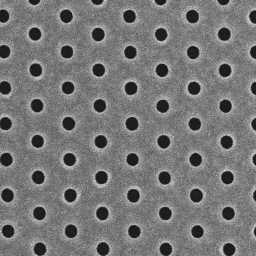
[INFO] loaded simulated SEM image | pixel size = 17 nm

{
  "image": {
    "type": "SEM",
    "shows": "a regular array of holes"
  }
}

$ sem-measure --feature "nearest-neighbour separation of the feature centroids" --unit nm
606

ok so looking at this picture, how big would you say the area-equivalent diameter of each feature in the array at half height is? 0.228 microns